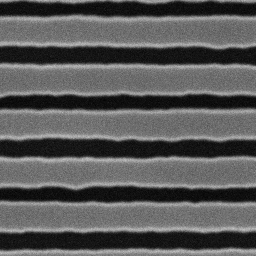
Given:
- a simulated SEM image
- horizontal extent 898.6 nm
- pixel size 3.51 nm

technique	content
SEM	lines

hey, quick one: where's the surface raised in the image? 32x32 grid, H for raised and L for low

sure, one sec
LLLLLLLLLLLLLLLLLLLLLLLLLLLLLLLL
LLLLLLLLLLLLLLLLLLLLLLLLLLLLLLLL
HHHHHHHHHHHHHHHHHHHHHHHHHHHHHHHH
HHHHHHHHHHHHHHHHHHHHHHHHHHHHHHHH
HHHHHHHHHHHHHHHHHHHHHHHHHHHHHHHH
HHHHHHHHHHHHHHHHHHHHHHHHHHHHHHHH
LLLLLLLLLLLLLLLLLLLLLLLLLLLLLLLL
LLLLLLLLLLLLLLLLLLLLLLLLLLLLLLLL
HHHHHHHHHHHHHHHHHHHHHHHHHHHHHHHH
HHHHHHHHHHHHHHHHHHHHHHHHHHHHHHHH
HHHHHHHHHHHHHHHHHHHHHHHHHHHHHHHH
HHHHHHHHHHHHHHHHHHHHHHHHHHHHHHHH
LLLLLLLLLLLLLLLLLLLLLLLLLLLLLLLL
LLLLLLLLLLLLLLLLLLLLLLLLLLLLLLLL
HHHHHHHHHHHHHHHHHHHHHHHHHHHHHHHH
HHHHHHHHHHHHHHHHHHHHHHHHHHHHHHHH
HHHHHHHHHHHHHHHHHHHHHHHHHHHHHHHH
LLLLLLLLLLLLLLHLLLLHHHLLLLHHLLLL
LLLLLLLLLLLLLLLLLLLLLLLLLLLLLLLL
LLLLLLLLLLLLLLLLLLLLLLLLLLLLLLLL
HHHHHHHHHHHHHHHHHHHHHHHHHHHHHHHH
HHHHHHHHHHHHHHHHHHHHHHHHHHHHHHHH
HHHHHHHHHHHHHHHHHHHHHHHHHHHHHHHH
LLLHLLLLHHLLLLLLLLLLLLLHHLHHLLLL
LLLLLLLLLLLLLLLLLLLLLLLLLLLLLLLL
HHHHHHHHHHHHHHHHHHHHHHHHHHHHHHHH
HHHHHHHHHHHHHHHHHHHHHHHHHHHHHHHH
HHHHHHHHHHHHHHHHHHHHHHHHHHHHHHHH
HHHHHHHHHHHHHHHHHHHHHHHHHHHHHHHH
LLLLLLLLLLLLLLLLLLLLLLLLLLLLLLLL
LLLLLLLLLLLLLLLLLLLLLLLLLLLLLLLL
HHHHHHHHHHHHHHHHHHHHHHHHHHHHHHHH